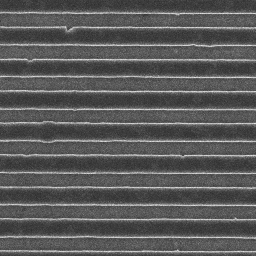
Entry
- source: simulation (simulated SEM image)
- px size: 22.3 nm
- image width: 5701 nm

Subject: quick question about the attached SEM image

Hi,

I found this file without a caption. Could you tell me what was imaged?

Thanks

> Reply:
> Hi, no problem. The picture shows parallel lines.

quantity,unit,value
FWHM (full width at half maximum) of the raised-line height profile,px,18.5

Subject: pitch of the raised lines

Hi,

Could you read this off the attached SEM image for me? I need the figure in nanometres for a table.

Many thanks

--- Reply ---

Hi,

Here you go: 712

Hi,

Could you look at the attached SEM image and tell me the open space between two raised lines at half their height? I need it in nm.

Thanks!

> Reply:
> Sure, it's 301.